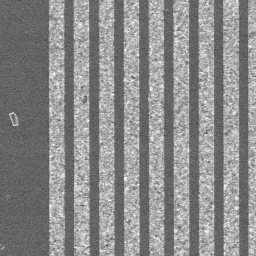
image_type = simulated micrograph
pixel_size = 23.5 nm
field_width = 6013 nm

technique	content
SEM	parallel lines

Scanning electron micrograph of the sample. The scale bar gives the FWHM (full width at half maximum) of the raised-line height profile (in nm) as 349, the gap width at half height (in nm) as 241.